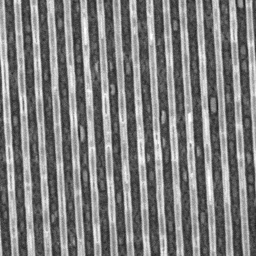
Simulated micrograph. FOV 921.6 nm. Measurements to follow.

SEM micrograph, parallel lines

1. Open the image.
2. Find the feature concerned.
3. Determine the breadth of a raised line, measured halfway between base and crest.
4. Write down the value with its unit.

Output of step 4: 22.9 nm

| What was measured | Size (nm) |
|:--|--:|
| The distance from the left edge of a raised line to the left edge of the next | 59.4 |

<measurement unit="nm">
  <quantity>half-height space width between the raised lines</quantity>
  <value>36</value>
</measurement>